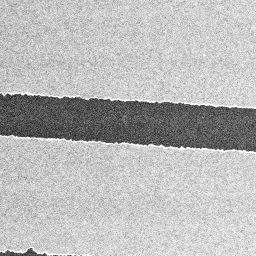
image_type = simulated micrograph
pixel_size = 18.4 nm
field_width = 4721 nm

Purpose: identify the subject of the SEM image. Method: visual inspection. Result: one or a few lines or trenches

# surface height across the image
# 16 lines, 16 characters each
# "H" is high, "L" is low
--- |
HHHHHHHHHHHHHHHH
HHHHHHHHHHHHHHHH
HHHHHHHHHHHHHHHH
HHHHHHHHHHHHHHHH
HHHHHHHHHHHHHHHH
HHHHHHHHHHHHHHHH
LLLLLLLLLLLLHHHH
LLLLLLLLLLLLLLLL
LLLLLLLLLLLLLLLL
HHHHHHHHHHHHHHHH
HHHHHHHHHHHHHHHH
HHHHHHHHHHHHHHHH
HHHHHHHHHHHHHHHH
HHHHHHHHHHHHHHHH
HHHHHHHHHHHHHHHH
HHHHHHHHHHHHHHHH